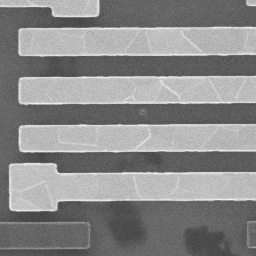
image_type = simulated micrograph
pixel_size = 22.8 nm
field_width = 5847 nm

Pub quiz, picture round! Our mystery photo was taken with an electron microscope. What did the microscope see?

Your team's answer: wiring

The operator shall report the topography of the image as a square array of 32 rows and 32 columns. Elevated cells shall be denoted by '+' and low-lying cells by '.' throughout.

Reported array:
++++++++++++...................+
.......+++++....................
................................
................................
..++++++++++++++++++++++++++++++
..++++++++++++++++++++++++++++++
..++++++++++++++++++++++++++++++
................................
................................
................................
..++++++++++++++++++++++++++++++
..++++++++++++++++++++++++++++++
..++++++++++++++++++++++++++++++
................................
................................
................................
..++++++++++++++++++++++++++++++
..++++++++++++++++++++++++++++++
..++++++++++++++++++++++++++++++
................................
................................
.++++++.........................
.+++++++++++++++++++++++++++++++
.+++++++++++++++++++++++++++++++
.+++++++++++++++++++++++++++++++
.++++++.........................
................................
................................
+++++++++++....................+
+++++++++++....................+
+++++++++++....................+
................................